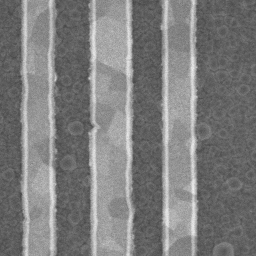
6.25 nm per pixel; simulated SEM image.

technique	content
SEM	one or a few lines or trenches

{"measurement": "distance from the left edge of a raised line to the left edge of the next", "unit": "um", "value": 0.441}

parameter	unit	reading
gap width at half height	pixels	40.8